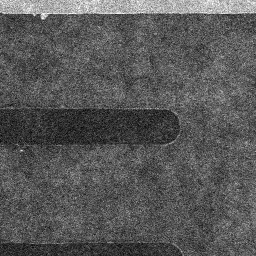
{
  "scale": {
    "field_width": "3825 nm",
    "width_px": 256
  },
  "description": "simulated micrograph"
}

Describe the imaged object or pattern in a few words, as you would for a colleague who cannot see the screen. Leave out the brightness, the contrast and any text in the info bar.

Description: one or a few lines or trenches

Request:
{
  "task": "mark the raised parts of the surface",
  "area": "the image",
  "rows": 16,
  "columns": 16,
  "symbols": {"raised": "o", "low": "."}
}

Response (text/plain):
oooooooooooooooo
................
................
................
................
................
................
ooooooooooo.....
ooooooooooo.....
................
................
................
................
................
................
ooooooooooo.....